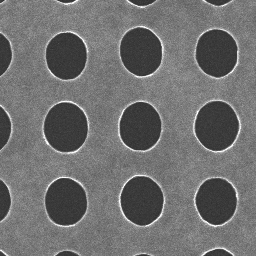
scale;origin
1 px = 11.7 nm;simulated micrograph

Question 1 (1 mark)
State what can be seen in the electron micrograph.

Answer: a regular array of holes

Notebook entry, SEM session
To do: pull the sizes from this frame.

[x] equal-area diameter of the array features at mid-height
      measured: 530 nm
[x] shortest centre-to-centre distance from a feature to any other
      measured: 74.2 pixels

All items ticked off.